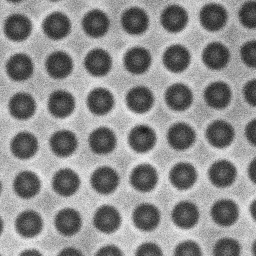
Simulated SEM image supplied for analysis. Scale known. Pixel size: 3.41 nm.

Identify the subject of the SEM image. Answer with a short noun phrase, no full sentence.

an array of small figures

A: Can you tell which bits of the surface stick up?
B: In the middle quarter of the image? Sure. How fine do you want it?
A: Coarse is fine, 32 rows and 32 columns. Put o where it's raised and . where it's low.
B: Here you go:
...oo...o...ooo.......ooo.......
..ooo.......ooo......oooo......o
..oooo.....oooooo...ooooooo..ooo
.oooooo..ooooooooooooooooooooooo
oooooooooooooooooooooooooooo..oo
oooooooo.ooooooooo..oooooo.....o
oooooo......oooo......ooo.......
..oooo......ooo........oo.......
...oo........oo........oo.......
...oo...oo...oo........oo.......
...ooo.......oo........oo.......
...ooo......oooo......oooo.....o
..ooooo....oooooo....ooooooooooo
.ooooooooooooooooooooooooooooooo
oooooooooooooooooooooooooooo...o
ooooooooo..oooooo.....oooo......
..ooooo.....oooo.......ooo......
...ooo.......ooo.......oo.......
...ooo.......oo........oo.......
....oo........oo.......ooo......
....oo.......ooo.......ooo......
...oooo......oooo.....oooooo...o
...ooooo...ooooooo...ooooooooooo
.ooooooooooooooooooooooooooooooo
ooooooooooooooooooo..ooooooo....
ooooooooo...ooooo......oooo.....
...oooo......oooo......ooo......
....ooo.......oo........oo......
....oo........oo........oo......
....oo........oo........oo......
....ooo.......ooo.......ooo.....
....ooo......ooooo.....ooooo....